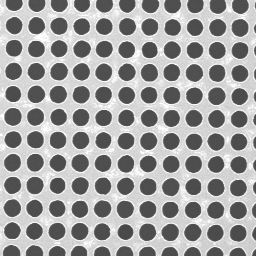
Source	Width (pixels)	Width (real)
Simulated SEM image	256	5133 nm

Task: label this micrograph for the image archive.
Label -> a regular array of holes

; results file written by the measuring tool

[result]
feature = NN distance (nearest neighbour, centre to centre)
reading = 450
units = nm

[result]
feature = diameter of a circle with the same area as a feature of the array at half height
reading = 346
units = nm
